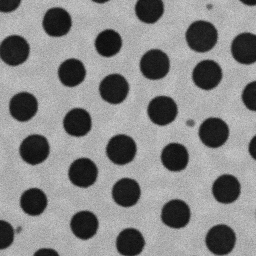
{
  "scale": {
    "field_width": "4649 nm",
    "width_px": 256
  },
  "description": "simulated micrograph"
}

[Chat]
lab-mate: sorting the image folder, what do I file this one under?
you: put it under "a regular array of holes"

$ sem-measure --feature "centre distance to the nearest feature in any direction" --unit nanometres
837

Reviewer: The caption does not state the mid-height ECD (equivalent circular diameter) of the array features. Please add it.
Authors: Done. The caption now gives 536 nanometers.